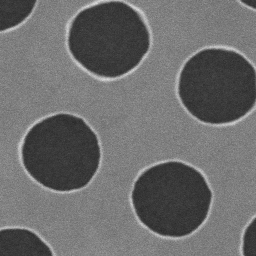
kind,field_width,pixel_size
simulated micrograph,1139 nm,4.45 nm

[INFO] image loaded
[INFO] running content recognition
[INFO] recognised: holes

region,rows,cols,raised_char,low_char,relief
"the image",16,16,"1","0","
0011110011111111
0111000001111111
1111000001111111
1111100001110001
1111110011100000
1111111111100000
1111111111100000
1110011111111001
1100001111111111
1000001111111111
1100001110001111
1110011100000111
1111111100000111
1111111110000111
0011111111001110
0001111111111110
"